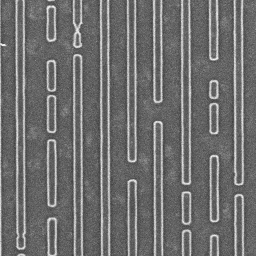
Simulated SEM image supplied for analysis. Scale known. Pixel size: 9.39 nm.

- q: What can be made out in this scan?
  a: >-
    parallel lines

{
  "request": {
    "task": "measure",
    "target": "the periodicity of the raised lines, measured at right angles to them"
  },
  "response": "27.3 pixels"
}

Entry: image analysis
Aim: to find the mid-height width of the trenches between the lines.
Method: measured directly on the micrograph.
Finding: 0.183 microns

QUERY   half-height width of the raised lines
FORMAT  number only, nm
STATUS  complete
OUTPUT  66.9